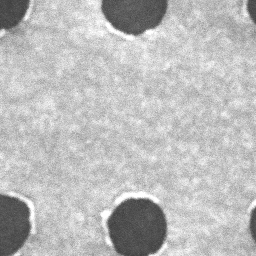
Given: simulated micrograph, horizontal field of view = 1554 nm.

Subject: holes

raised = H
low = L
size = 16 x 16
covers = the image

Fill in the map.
LLHHHHLLLLHHHHHL
LHHHHHHLLLHHHHHH
HHHHHHHHHHHHHHHH
HHHHHHHHHHHHHHHH
HHHHHHHHHHHHHHHH
HHHHHHHHHHHHHHHH
HHHHHHHHHHHHHHHH
HHHHHHHHHHHHHHHH
HHHHHHHHHHHHHHHH
HHHHHHHHHHHHHHHH
HHHHHHHHHHHHHHHH
HHHHHHHHHHHHHHHH
LHHHHHHHLHHHHHHH
LLHHHHHLLLHHHHHH
LLHHHHHLLLHHHHHH
LHHHHHHLLLHHHHHH